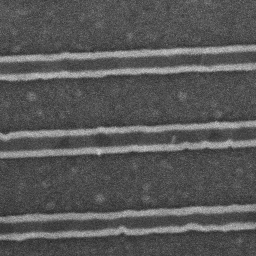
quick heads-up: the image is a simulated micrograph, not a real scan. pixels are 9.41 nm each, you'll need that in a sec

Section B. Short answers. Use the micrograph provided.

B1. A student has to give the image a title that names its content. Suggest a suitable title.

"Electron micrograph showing one or a few lines or trenches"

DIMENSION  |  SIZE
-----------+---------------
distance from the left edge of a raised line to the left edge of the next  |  751 nanometres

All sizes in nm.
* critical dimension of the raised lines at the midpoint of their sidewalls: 175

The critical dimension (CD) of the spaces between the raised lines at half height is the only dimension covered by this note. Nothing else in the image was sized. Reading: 0.577 microns